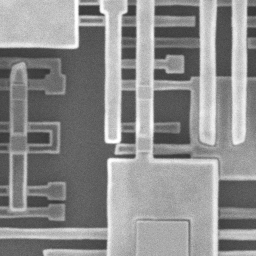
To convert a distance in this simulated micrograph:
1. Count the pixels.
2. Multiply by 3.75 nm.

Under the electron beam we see wiring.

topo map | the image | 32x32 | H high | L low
HHHHHHHHHHLLLHHHLHHLLLLLLHHLLHHL
HHHHHHHHHHLLLHHHLHHLLLLLLHHLLHHL
HHHHHHHHHHLLLHHLLHHLLLLLLHHLLHHL
HHHHHHHHHHLLLHHLLHHLLLLLLHHLLHHL
HHHHHHHHHHLLLHHLLHHLLLLLLHHLLHHL
HHHHHHHHHHLLLHHLLHHLLLLLLHHLLHHL
LLLLLLLLLLLLLHHLLHHLLLLLLHHLLHHL
LLLLLLLLLLLLLHHLLHHLLLLLLHHLLHHL
LLHLLLLLLLLLLHHLLHHLLLLLLHHLLHHL
LHHLLLLLLLLLLHHLLHHLLLLLLHHLLHHL
LHHLLLLLLLLLLHHLLHHLLLLLLHHLLHHL
LHHLLLLLLLLLLHHLLHHLLLLLLHHLLHHL
LHHLLLLLLLLLLHHLLHHLLLLLLHHLLHHL
LHHLLLLLLLLLLHHLLHHLLLLLLHHLLHHL
LHHLLLLLLLLLLHHLLHHLLLLLLHHLLHHL
LHHLLLLLLLLLLHHLLHHLLLLLLHHLLHHL
LHHLLLLLLLLLLHHLLHHLLLLLLHHLLHHL
LHHLLLLLLLLLLHHLLHHLLLLLLHHLLHLL
LHHLLLLLLLLLLLLLLHHLLLLLLLLLLLLL
LHHLLLLLLLLLLLLLLHHLLLLLLLLLLLLL
LHHLLLLLLLLLLLHHHHHHHHHHHHHLLLLL
LHHLLLLLLLLLLLHHHHHHHHHHHHHLLLLL
LHHLLLLLLLLLLLHHHHHHHHHHHHHLLLLL
LHHLLLLLLLLLLLHHHHHHHHHHHHHLLLLL
LHHLLLLLLLLLLLHHHHHHHHHHHHHLLLLL
LHHLLLLLLLLLLHHHHHHHHHHHHHHLLLLL
LLLLLLLLLLLLLLHHHHHHHHHHHHHLLLLL
LLLLLLLLLLLLLLHHHHHHHHHHHHHLLLLL
LLLLLLLLLLLLLLHHHHHHHHHHHHHLLLLL
LLLLLLLLLLLLLLHHHHHHHHHHHHHLLLLL
LLLLLLLLLLLLLHHHHHHHHHHHHHHLLLLL
LLLLLLLLLLLLLHHHHHHHHHHHHHHLLLLL